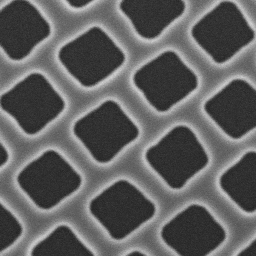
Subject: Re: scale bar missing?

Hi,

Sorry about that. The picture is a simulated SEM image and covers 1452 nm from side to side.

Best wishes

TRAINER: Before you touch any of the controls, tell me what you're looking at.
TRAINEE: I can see holes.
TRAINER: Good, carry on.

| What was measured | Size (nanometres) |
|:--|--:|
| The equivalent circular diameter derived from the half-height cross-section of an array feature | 321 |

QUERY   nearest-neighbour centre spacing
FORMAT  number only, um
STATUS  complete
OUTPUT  0.428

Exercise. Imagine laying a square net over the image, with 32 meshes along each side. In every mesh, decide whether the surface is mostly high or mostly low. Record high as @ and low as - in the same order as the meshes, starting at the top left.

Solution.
@---@@@@@--@@@@--------@@@@--@@@
-----@@@@@@@@@@--------@@@----@@
------@@@@@@@@@@------@@@------@
------@@@@@-@@@@@----@@@-------@
------@@@@----@@@---@@@@--------
-----@@@------@@@@@@@@@@@------@
@---@@@--------@@@@@@-@@@@----@@
@@-@@@@---------@@@----@@@@--@@@
@@@@@@@@-------@@@------@@@@@@@@
@@@--@@@@-----@@@-------@@@@@@@@
@@----@@@@--@@@@@--------@@@---@
@------@@@@@@@@@@@------@@@-----
--------@@@@@@@@@@-----@@@------
--------@@@@---@@@@--@@@@-------
@------@@@------@@@@@@@@@@------
@@----@@@--------@@@@@@@@@@-----
@@@--@@@@--------@@@@---@@@@---@
@@@@@@@@@@-------@@@-----@@@@@@@
-@@@@@@@@@@----@@@@------@@@@@@@
-@@@@---@@@@--@@@@--------@@@@--
-@@@-----@@@@@@@@@@-------@@@---
@@@-------@@@@@@@@@@-----@@@----
@@--------@@@@@@@@@@----@@@-----
@@@-------@@@----@@@@@-@@@@@----
@@@@-----@@@------@@@@@@@@@@@---
@@@@---@@@@--------@@@@@@@@@@@--
-@@@@@@@@@@--------@@@@---@@@@@-
--@@@@@@@@@@-------@@------@@@@@
---@@@@--@@@@----@@@--------@@@@
--@@@@----@@@@--@@@@--------@@@@
-@@@-------@@@@@@@@@@-------@@@-
@@@@--------@@@@-@@@@@----@@@@--